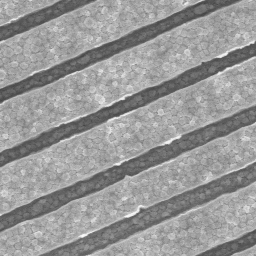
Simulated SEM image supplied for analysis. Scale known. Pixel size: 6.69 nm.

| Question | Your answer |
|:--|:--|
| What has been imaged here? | parallel lines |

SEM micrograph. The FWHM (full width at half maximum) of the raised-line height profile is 289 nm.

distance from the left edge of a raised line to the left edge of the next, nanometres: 383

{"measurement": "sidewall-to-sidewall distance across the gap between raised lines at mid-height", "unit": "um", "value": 0.0989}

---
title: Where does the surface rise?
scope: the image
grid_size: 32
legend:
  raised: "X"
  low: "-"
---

XXXXXXX----XXXXXXXXXXXXX-----XXX
XXXX-----XXXXXXXXXXXXX-----XXXXX
XX----XXXXXXXXXXXXXX----XXXXXXXX
----XXXXXXXXXXXXX-----XXXXXXXXXX
--XXXXXXXXXXXXX-----XXXXXXXXXXXX
XXXXXXXXXXXXX-----XXXXXXXXXXXXX-
XXXXXXXXXXX----XXXXXXXXXXXXXX---
XXXXXXXXX----XXXXXXXXXXXXX-----X
XXXXXX-----XXXXXXXXXXXXX----XXXX
XXXX----XXXXXXXXXXXXXX----XXXXXX
XX----XXXXXXXXXXXXXX----XXXXXXXX
---XXXXXXXXXXXXXX-----XXXXXXXXXX
-XXXXXXXXXXXXXX-----XXXXXXXXXXXX
XXXXXXXXXXXXX----XXXXXXXXXXXXXX-
XXXXXXXXXXX----XXXXXXXXXXXXXX---
XXXXXXXX-----XXXXXXXXXXXXX------
XXXXX-----XXXXXXXXXXXXXX-----XXX
XXX-----XXXXXXXXXXXXXX-----XXXXX
X-----XXXXXXXXXXXXX-----XXXXXXXX
---XXXXXXXXXXXXXX-----XXXXXXXXXX
-XXXXXXXXXXXXXX-----XXXXXXXXXXX-
XXXXXXXXXXXX------XXXXXXXXXXX---
XXXXXXXXXX-----XXXXXXXXXXXX-----
XXXXXXXX-----XXXXXXXXXXX------XX
XXXXX------XXXXXXXXXXX------XXXX
XXX-----XXXXXXXXXXX-------XXXXXX
X-----XXXXXXXXXXX------XXXXXXXXX
----XXXXXXXXXXX------XXXXXXXXXXX
-XXXXXXXXXXXX------XXXXXXXXXXXXX
XXXXXXXXXXX-----XXXXXXXXXXXXXX--
XXXXXXXX------XXXXXXXXXXXXXX----
XXXXXX------XXXXXXXXXXXXX-----XX